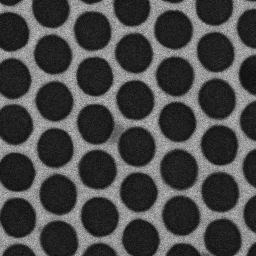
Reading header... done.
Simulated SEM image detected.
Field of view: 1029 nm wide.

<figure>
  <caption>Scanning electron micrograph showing a regular array of holes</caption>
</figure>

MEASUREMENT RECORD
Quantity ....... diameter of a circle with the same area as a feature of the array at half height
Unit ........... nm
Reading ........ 152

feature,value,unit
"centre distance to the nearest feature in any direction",45.8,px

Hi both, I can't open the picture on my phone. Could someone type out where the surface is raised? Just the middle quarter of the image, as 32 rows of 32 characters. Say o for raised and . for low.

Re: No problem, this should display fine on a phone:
.ooo.......ooo.......ooo........
ooo.........ooo.....ooo.........
ooo.........ooooooooooo.........
ooo.........ooooooooooo.........
ooo.........oooo...oooo.........
oooo........oo.......ooo........
.oooo......ooo........ooo......o
..oooo....ooo.........oooo....oo
..ooooooooooo.........oooooooooo
..ooooooooooo.........oooooooooo
..oooo....ooo.........ooo......o
..ooo......ooo........ooo.......
.ooo........ooo......ooo........
ooo.........oooo....oooo........
ooo.........oooooooooooo........
ooo.........oooooooooooo........
oooo........oooo....oooo........
.ooo........ooo......oooo.......
..ooo......ooo........oooo.....o
..oooo....oooo.........ooooooooo
..oooooooooooo.........ooooooooo
..oooooooooooo.........ooooo.ooo
..oooo.....ooo........oooo.....o
..ooo.......ooo.......ooo.......
.ooo.........ooo.....ooo........
oooo.........ooooo.ooooo........
oooo.........ooooooooooo........
oooo.........oooo...oooo........
.ooo.........ooo......ooo.......
..ooo.......ooo........oo.......
...ooo.....ooo.........oooo.....
...ooooooooooo.........ooooooooo